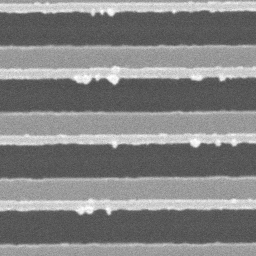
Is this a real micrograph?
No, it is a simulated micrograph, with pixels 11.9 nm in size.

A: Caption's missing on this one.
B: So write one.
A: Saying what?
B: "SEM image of lines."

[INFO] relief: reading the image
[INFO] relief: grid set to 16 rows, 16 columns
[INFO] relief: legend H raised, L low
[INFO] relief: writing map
HHHHHHHHHHHHHHHH
LLLLLLLLLLLLLLLL
LLLLLLLLLLLLLLLL
HHHHHHHHHHHHHHHH
HHHHHHHHHHHHHHHH
LLLLLLLLLLLLLLLL
LLLLLLLLLLLLLLLL
HHHHHHHHHHHHHHHH
HHHHHHHHHHHHHHHH
LLLLLLLLLLLLLLLL
LLLLLLLLLLLLLLLL
HHHHHHHHHHHHHHHH
HHHHHHHHHHHHHHHH
LLLLLLLLLLLLLLLL
LLLLLLLLLLLLLLLL
HHHHHHHHHHHHHHHH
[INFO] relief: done